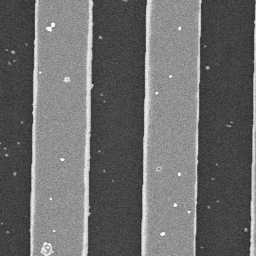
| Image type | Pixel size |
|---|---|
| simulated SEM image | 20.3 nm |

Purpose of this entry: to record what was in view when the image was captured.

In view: lines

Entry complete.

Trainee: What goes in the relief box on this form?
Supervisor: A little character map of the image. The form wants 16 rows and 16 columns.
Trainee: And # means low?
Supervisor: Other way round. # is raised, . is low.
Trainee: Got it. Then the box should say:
..####...####...
..####...####...
..####...####...
..####...###....
..####...###....
..####...###....
..####...###....
..####...###....
..####...###....
..####...###....
..###....###....
..###....###....
..###....###....
..###....###....
..###....###....
..###....###....